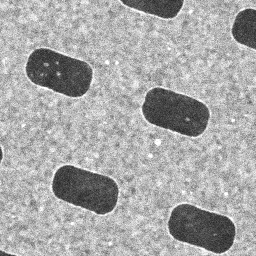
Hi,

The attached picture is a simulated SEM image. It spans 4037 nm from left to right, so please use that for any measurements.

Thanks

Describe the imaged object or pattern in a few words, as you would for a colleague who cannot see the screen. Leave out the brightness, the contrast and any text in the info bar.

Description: holes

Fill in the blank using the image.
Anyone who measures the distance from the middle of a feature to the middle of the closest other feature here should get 1880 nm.